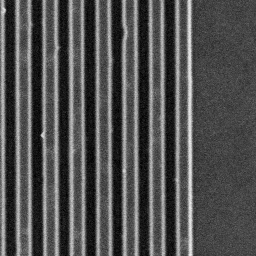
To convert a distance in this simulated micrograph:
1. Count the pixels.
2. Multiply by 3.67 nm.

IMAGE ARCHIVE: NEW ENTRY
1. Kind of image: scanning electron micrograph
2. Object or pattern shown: parallel lines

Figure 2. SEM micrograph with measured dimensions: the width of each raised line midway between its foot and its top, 0.0477 µm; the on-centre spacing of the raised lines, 97.9 nm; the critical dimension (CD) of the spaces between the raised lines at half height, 47.7 nanometres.